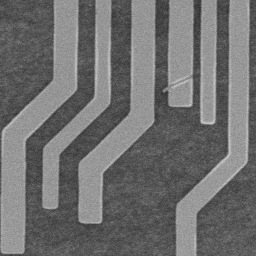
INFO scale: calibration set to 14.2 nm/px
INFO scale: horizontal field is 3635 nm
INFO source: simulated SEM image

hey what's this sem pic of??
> groups of lines, slits or small figures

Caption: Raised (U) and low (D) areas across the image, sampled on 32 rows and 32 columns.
DDDDDDDUUUDDUUDDDUUDDUUUDUUDDUUD
DDDDDDDUUUDDUUDDDUUDDUUUDUUDDUUD
DDDDDDDUUUDDUUDDDUUDDUUUDUUDDUUD
DDDDDDDUUUDDUUDDDUUDDUUUDUUDDUUD
DDDDDDDUUUDDUUDDDUUDDUUUDUUDDUUD
DDDDDDDUUUDDUUDDDUUDDUUUDUUDDUUD
DDDDDDDUUUDDUUDDDUUDDUUUDUUDDUUD
DDDDDDDUUUDDUUDDDUUDDUUUDUUDDUUD
DDDDDDDUUUDDUUDDDUUDDUUUDUUDDUUD
DDDDDDDUUUDDUUDDDUUDDUUUDUUDDUUD
DDDDDDUUUUDDUUDDUUUDDUUUDUUDDUUD
DDDDDUUUUDDDUUDDUUUDDUUUDUUDDUUD
DDDDUUUUDDDDUUDDUUUDDUUUDUUDDUUD
DDDUUUUDDDDUUDDDUUUDDDDDDUUDDUUD
DDUUUUDDDDUUDDDDUUUDDDDDDUUDDUUD
DUUUUDDDDUUDDDDUUUUDDDDDDDDDDUUD
UUUUDDDUUUDDDDUUUUDDDDDDDDDDDUUD
UUUDDDUUUDDDDUUUUDDDDDDDDDDDDUUD
UUUDDDUUDDDDUUUUDDDDDDDDDDDDDUUD
UUUDDUUDDDDUUUUDDDDDDDDDDDDDUUUD
UUUDDUUDDDUUUUDDDDDDDDDDDDDUUUUD
UUUDDUUDDDUUUDDDDDDDDDDDDDUUUUDD
UUUDDUUDDDUUUDDDDDDDDDDDDUUUUDDD
UUUDDUUDDDUUUDDDDDDDDDDDUUUUDDDD
UUUDDUUDDDUUUDDDDDDDDDDUUUUDDDDD
UUUDDUUDDDUUUDDDDDDDDDUUUUDDDDDD
UUUDDDDDDDUUUDDDDDDDDDUUUDDDDDDD
UUUDDDDDDDUUUDDDDDDDDDUUDDDDDDDD
UUUDDDDDDDDDDDDDDDDDDDUUDDDDDDDD
UUUDDDDDDDDDDDDDDDDDDDUUDDDDDDDD
UUUDDDDDDDDDDDDDDDDDDDUUDDDDDDDD
UUUDDDDDDDDDDDDDDDDDDDUUDDDDDDDD